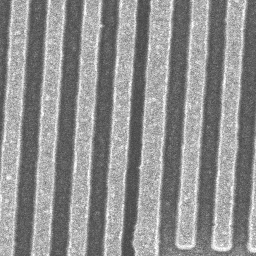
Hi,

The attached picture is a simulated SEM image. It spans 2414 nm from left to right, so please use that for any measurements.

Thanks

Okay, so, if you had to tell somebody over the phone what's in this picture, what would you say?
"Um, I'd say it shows parallel lines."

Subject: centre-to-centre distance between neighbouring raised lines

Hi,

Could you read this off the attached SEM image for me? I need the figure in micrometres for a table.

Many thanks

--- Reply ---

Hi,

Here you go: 0.339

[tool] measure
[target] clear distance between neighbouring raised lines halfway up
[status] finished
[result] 0.164 µm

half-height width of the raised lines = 181 nanometres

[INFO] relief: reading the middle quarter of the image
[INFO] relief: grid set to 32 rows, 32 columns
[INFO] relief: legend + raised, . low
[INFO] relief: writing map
....++++.....++++....+++++.....+
....++++.....++++...++++++.....+
....++++.....++++...++++++.....+
....++++.....++++...++++++.....+
....++++....+++++...++++++.....+
....++++....+++++...++++++.....+
....++++....+++++...++++++.....+
...+++++....+++++...++++++....++
...+++++....+++++...++++++....++
...+++++....+++++...+++++.....++
...+++++....+++++...+++++.....++
...+++++....+++++...+++++.....++
...+++++....+++++...+++++.....++
...+++++....+++++...+++++.....++
...+++++....+++++...+++++.....++
...++++.....++++....+++++.....++
...++++.....++++....+++++.....++
...++++.....++++...++++++.....++
...++++.....++++...++++++.....++
...++++.....++++...++++++.....++
..+++++.....++++....+++++....+++
..+++++....+++++...++++++....+++
...++++....+++++...++++++....+++
..+++++....+++++...++++++....+++
..+++++....+++++...++++++....+++
..+++++....+++++...++++++....+++
..+++++....+++++...++++++....+++
..+++++....++++....++++++....+++
..+++++....++++....+++++.....+++
..+++++....+++++...+++++.....+++
..+++++....+++++...+++++.....+++
..+++++....++++....+++++.....+++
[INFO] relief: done